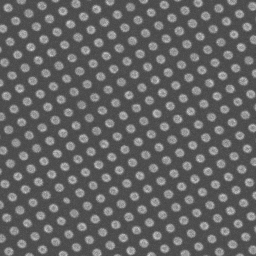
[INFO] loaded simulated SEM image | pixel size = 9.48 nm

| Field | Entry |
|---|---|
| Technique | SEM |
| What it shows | a regular array of raised bodies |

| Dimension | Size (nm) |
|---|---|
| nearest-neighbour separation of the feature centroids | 142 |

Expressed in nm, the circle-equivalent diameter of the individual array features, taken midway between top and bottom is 80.